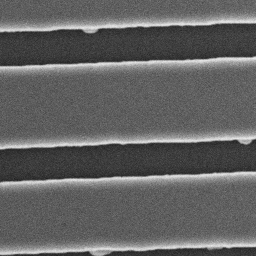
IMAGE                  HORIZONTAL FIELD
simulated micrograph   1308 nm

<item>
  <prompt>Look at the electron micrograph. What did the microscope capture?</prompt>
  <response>lines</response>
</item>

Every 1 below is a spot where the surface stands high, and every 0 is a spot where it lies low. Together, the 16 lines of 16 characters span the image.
1111111111111111
1111111111111000
0000000000000000
0000000000000000
1111111111111111
1111111111111111
1111111111111111
1111111111111111
1111111111111111
0000000000000000
0000000000000000
1111111111111111
1111111111111111
1111111111111111
1111111111111111
1111111111100000